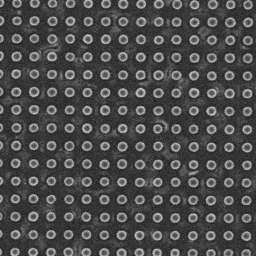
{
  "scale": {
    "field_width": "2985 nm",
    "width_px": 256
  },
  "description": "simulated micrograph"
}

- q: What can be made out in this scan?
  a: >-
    a regular array of raised bodies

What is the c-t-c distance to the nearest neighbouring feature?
202 nanometers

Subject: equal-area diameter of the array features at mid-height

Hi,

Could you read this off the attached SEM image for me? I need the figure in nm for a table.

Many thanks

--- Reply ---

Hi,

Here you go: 102